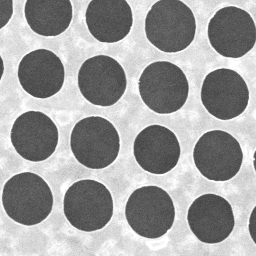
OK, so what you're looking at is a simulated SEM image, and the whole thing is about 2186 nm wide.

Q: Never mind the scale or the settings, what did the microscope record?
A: a regular array of holes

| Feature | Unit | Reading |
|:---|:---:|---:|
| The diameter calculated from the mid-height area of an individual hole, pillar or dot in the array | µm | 0.43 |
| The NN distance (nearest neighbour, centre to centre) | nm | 523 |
